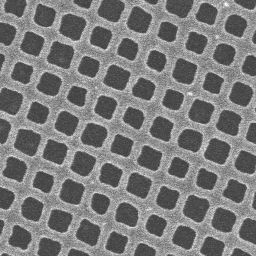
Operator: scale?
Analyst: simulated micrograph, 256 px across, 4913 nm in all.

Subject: a regular array of holes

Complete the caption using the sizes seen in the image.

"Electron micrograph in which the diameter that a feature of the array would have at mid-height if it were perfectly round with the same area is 447 nanometres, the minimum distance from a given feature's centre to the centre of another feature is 575 nanometers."